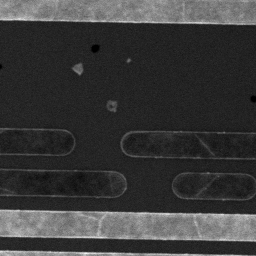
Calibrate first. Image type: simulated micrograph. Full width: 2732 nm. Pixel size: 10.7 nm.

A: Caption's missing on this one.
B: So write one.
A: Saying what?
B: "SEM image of groups of lines, slits or small figures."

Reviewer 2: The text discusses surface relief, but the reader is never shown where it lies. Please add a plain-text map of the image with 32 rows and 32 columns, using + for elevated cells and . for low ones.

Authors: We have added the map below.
++++++++++++++++++++++++++++++++
++++++++++++++++++++++++++++++++
....++++++++++++++++++++++++++++
................................
................................
................................
................................
................................
.........+......................
................................
................................
................................
................................
................................
................................
................................
+++++++++.......................
+++++++++......+++++++++++++++++
+++++++++......+++++++++++++++++
................++++++++++++++++
................................
++++++++++++....................
++++++++++++++++......++++++++++
++++++++++++++++......++++++++++
.........++++++.......++++++++++
................................
+++++++..+......................
++++++++++++++++++++++++++++++++
++++++++++++++++++++++++++++++++
..++++++++++++++++++++++++++++++
................................
+++.............................